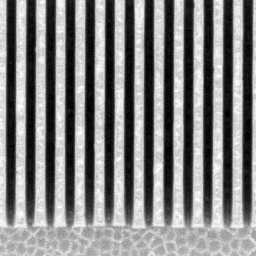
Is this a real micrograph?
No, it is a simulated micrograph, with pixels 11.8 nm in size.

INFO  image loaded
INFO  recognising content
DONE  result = parallel lines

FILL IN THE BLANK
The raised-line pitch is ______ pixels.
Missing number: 19.7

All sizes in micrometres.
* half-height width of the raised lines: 0.124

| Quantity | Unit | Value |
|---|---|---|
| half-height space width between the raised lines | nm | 104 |